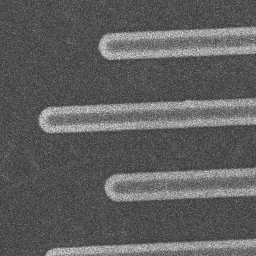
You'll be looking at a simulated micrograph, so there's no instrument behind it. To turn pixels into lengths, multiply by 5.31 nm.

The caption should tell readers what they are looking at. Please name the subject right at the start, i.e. one or a few lines or trenches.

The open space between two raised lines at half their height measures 265 nm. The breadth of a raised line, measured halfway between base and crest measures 109 nm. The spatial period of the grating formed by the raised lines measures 376 nm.